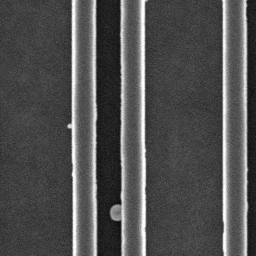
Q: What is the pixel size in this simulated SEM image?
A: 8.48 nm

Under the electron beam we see lines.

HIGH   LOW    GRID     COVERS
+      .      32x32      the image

.........+++...+++..........+++.
.........+++...+++..........+++.
.........+++...+++..........+++.
.........+++...+++..........+++.
.........+++...+++..........+++.
.........+++...+++..........+++.
.........+++...+++..........+++.
.........+++...+++..........+++.
.........+++...+++..........+++.
.........+++...+++..........+++.
.........+++...+++..........+++.
.........+++...+++..........+++.
.........+++...+++..........+++.
.........+++...+++..........+++.
.........+++...+++..........+++.
.........+++...+++..........+++.
.........+++...+++..........+++.
.........+++...+++..........+++.
.........+++...+++..........+++.
.........+++...+++..........+++.
.........+++...+++..........+++.
.........+++...+++..........+++.
.........+++...+++..........+++.
.........+++...+++..........+++.
.........+++...+++..........+++.
.........+++...+++..........+++.
.........+++...+++..........+++.
.........+++...+++..........+++.
.........+++...+++..........+++.
.........+++...+++..........+++.
.........+++...+++..........+++.
.........+++...+++..........+++.